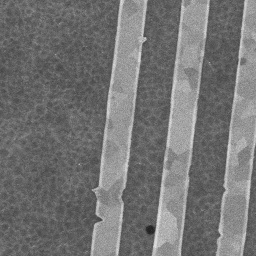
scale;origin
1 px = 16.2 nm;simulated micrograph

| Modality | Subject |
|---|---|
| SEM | one or a few lines or trenches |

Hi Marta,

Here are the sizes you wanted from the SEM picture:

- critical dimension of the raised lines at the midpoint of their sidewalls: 390 nm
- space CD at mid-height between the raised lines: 0.618 microns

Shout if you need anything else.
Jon